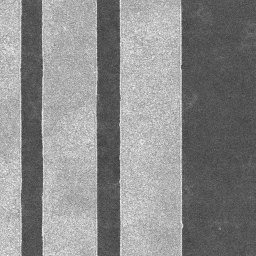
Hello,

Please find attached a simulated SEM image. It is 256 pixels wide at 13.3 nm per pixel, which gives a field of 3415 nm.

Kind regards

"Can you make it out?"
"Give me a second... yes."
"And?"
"one or a few lines or trenches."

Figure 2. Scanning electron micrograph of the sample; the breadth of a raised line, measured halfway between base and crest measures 766 nanometers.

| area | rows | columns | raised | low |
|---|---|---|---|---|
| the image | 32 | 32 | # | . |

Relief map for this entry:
###..#######...########.........
###..#######...########.........
###..#######...########.........
###..#######...########.........
###..#######...########.........
###..#######...########.........
##...#######...########.........
##...#######...########.........
##....######...########.........
###..#######...########.........
###..#######...########.........
###..#######...########.........
###..#######...########.........
###..#######...########.........
###..#######...########.........
###..#######...########.........
###..#######...########.........
###..#######...########.........
###..#######...########.........
###..#######...########.........
###...######...########.........
###...######...########.........
###...######...########.........
###..#######...########.........
###..#######...########.........
###..#######...########.........
###..#######...########.........
###..#######...########.........
###..#######...########.........
###..#######...########.........
###..#######...########.........
###..#######...########.........